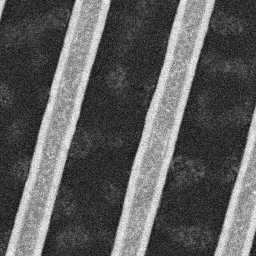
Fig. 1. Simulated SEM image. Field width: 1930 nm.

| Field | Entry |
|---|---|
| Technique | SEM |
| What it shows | one or a few lines or trenches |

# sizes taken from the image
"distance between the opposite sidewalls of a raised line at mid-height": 191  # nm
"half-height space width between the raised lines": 574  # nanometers